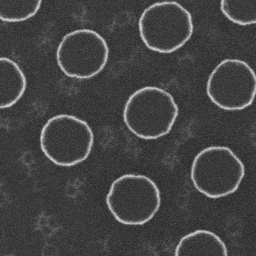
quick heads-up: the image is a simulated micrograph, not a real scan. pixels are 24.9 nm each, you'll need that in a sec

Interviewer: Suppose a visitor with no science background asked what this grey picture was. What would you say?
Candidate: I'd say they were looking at raised bodies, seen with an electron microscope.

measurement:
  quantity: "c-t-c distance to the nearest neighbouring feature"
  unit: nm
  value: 2180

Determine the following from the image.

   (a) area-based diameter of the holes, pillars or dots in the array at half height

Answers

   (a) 1240 nanometres